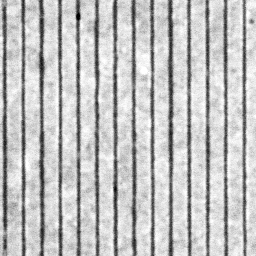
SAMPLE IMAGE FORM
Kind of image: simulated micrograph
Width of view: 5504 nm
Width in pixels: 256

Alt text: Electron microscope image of parallel lines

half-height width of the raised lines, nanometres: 288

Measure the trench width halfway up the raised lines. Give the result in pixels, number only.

5.25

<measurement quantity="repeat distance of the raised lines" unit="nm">396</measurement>